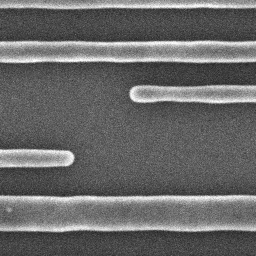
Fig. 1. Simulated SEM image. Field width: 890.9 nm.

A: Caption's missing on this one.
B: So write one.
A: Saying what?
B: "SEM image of groups of lines, slits or small figures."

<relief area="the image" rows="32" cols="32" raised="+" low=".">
++++++++++++++++++++++++++++++++
................................
................................
................................
................................
++++++++++++++++++++++++++++++++
++++++++++++++++++++++++++++++++
++++++++++++++++++++++++++++++++
................................
................................
................................
................++++++++++++++++
.................+++++++++++++++
................................
................................
................................
................................
................................
................................
+++++++++.......................
+++++++++.......................
................................
................................
................................
.............................++.
++++++++++++++++++++++++++++++++
++++++++++++++++++++++++++++++++
++++++++++++++++++++++++++++++++
++++++++++++++++++++++++++++++++
................................
................................
................................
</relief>